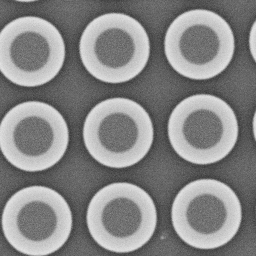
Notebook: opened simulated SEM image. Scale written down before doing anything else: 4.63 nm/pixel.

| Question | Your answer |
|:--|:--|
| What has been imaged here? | an array of small figures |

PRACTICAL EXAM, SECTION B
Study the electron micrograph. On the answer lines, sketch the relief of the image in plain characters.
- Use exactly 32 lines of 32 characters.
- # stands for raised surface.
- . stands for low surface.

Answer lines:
................................
.......................###......
..###.......#####.....######....
.######....#######...########...
########..########...########..#
########..#########..########..#
########..#########..########..#
########..########...########...
########...#######....######....
.######.....#####......####.....
..###...........................
................................
.............###.......#####....
..#####.....######....#######...
.#######...########..########...
########...########..#########..
########..#########..#########..
########...########..########...
########...########...#######...
.#######....######.....#####....
..#####......####...............
................................
.........................##.....
...###.......####......######...
..######....#######...#######...
.#######...########...########..
#########..########...########..
#########..#########..########..
#########..########...########..
.#######....#######...#######...
.#######....######......####....
...####.........................